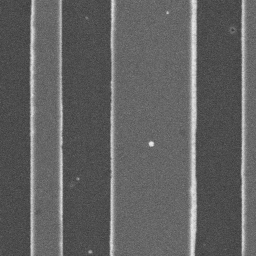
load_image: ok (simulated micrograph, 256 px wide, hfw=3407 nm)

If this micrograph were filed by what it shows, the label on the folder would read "lines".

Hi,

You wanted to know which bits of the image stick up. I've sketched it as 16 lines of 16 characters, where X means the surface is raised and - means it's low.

--XX---XXXXX---X
--XX---XXXXX---X
--XX---XXXXX---X
--XX---XXXXX---X
--XX---XXXXX---X
--XX---XXXXX---X
--XX---XXXXX---X
--XX---XXXXX---X
--XX---XXXXX---X
--XX---XXXXX---X
--XX---XXXXX---X
--XX---XXXXX---X
--XX---XXXXX---X
--XX---XXXXX---X
--XX---XXXXX---X
--XX---XXXXX---X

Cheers